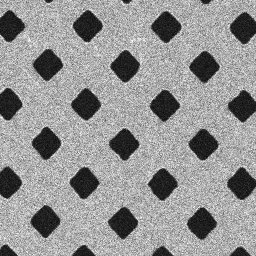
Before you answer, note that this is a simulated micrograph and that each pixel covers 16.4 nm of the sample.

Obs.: a regular array of holes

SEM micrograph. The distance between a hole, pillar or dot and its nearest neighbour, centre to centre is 903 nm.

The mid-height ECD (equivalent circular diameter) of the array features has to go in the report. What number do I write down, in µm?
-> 0.458